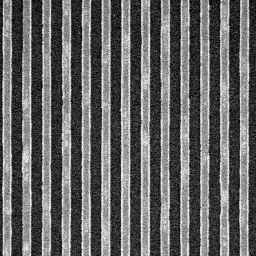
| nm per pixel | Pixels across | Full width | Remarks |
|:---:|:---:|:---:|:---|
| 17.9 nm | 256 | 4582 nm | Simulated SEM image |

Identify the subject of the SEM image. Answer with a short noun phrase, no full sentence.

parallel lines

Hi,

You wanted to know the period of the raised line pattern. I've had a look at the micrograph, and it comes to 354 nm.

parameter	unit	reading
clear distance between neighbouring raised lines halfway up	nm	226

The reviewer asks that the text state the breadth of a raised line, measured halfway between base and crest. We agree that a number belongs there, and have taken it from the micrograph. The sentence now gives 7.25 px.